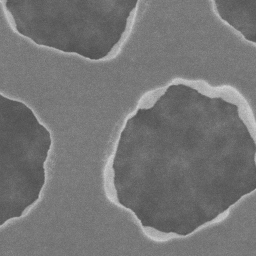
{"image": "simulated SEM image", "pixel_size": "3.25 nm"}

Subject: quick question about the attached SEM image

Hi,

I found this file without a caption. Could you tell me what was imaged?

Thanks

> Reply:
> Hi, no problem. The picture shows holes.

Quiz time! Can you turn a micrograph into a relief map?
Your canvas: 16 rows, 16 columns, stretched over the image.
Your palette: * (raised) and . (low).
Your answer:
........*****...
*.......******..
**......********
*****..*********
****************
**********..****
.********......*
..******........
...*****........
...****.........
...****.........
...****.........
..*****........*
.********.....**
*********...****
****************